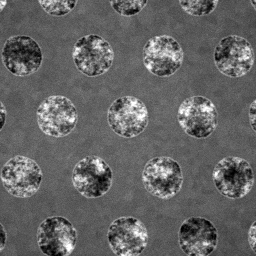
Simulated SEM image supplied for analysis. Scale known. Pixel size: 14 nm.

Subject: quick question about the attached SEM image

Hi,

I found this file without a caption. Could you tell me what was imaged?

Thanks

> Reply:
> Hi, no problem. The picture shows a regular array of holes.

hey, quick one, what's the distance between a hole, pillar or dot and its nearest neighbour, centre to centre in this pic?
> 0.981 microns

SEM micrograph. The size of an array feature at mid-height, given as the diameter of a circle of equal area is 0.556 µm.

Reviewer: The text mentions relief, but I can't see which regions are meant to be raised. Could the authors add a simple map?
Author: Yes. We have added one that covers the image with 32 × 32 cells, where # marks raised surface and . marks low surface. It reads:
.####....#####....#####....#####
######...######..######...######
################################
################################
###########.########.###########
#....#####....####....#####....#
.....####.....####.....####.....
.....####.....####.....####.....
#....#####....####....#####....#
###########.########.########.##
################################
################################
######...######..######...######
.####....#####....####.....####.
.####.....###.....####.....####.
.####....#####....#####....####.
######...#####....#####...######
################################
################################
################################
#...######...#####....#####....#
.....####.....####.....####.....
.....####.....####.....####.....
#....#####....####.....####....#
##..#######.########..######..##
################################
################################
######..#######..######...######
#####....#####....#####....####.
.####.....###.....####.....####.
.####....#####....####.....####.
#####....#####....#####...######